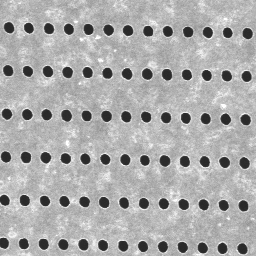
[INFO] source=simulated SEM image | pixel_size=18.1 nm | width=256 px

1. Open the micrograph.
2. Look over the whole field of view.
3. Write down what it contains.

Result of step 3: a regular array of holes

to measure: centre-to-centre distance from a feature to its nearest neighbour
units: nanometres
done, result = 358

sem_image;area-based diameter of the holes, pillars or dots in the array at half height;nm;189